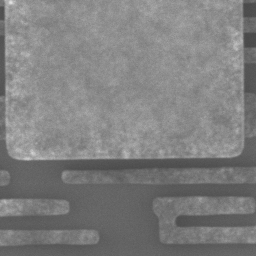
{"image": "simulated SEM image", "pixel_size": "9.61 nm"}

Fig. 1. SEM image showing wiring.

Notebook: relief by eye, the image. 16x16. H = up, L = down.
HHHHHHHHHHHHHHHL
HHHHHHHHHHHHHHHL
HHHHHHHHHHHHHHHL
HHHHHHHHHHHHHHHL
HHHHHHHHHHHHHHHL
HHHHHHHHHHHHHHHL
HHHHHHHHHHHHHHHL
HHHHHHHHHHHHHHHL
HHHHHHHHHHHHHHHL
LHHHHHHHHHHHHHHL
LLLLLLLLLLLLLLLL
LLLLLLLLLLLLLLLL
LLLLLLLLLLLLLLLL
LLLLLLLLLLLLLLLL
LLLLLLLLLLLLLLLL
LLLLLLLLLLLLLLLL